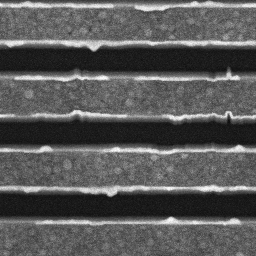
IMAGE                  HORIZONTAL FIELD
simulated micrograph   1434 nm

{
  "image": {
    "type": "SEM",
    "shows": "one or a few lines or trenches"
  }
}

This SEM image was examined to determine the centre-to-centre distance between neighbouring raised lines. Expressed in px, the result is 72.8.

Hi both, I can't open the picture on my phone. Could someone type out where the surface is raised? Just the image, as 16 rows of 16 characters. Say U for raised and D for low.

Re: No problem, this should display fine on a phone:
UUUUUUUUUUUUUUUU
UUUUUUUUUUUUUUUU
UUUUUUUUUUUUUUUU
DDDDDDDDDDDDDDDD
DDDDDDDDDDDDDDDD
UUUUUUUUUUUUUUUU
UUUUUUUUUUUUUUUU
DDDDDDDDDDDUDDDU
DDDDDDDDDDDDDDDD
UUUUUUUUUUUUUUUU
UUUUUUUUUUUUUUUU
UUUUUUUUUUUUUUUU
DDDDDDDDDDDDDDDD
DDDDDDDDDDDDDDDD
UUUUUUUUUUUUUUUU
UUUUUUUUUUUUUUUU